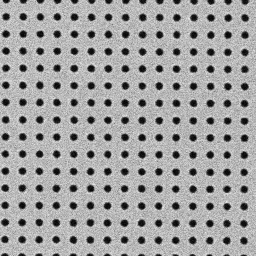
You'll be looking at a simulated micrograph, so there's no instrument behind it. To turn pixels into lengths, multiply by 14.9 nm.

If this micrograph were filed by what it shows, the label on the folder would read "a regular array of holes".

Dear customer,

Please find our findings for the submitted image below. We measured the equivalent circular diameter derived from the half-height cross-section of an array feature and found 117 nanometres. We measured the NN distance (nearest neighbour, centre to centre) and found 247 nanometres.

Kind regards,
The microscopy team